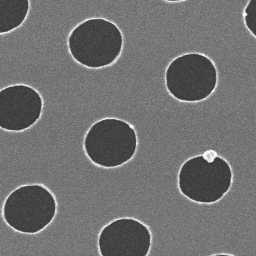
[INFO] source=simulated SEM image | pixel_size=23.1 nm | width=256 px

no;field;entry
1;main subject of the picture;holes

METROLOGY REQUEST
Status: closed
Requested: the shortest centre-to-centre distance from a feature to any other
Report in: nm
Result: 2330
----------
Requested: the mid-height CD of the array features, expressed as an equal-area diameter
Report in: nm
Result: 1140